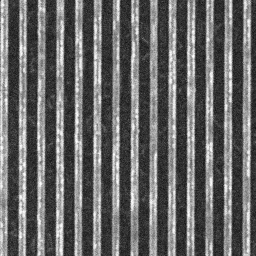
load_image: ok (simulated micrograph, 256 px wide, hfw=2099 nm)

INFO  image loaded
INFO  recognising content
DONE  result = parallel lines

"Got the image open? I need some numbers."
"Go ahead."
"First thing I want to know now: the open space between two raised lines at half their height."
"96.3 nm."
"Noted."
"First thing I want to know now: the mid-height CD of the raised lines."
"0.0594 microns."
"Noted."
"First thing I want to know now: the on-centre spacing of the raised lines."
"153 nm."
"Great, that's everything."